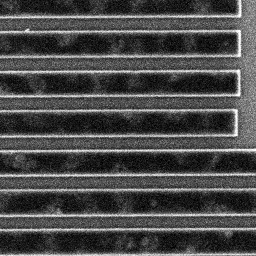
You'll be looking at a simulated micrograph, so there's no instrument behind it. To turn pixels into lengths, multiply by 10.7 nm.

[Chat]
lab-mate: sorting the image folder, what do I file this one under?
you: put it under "parallel lines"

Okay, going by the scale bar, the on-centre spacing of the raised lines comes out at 426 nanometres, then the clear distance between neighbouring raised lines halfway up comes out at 145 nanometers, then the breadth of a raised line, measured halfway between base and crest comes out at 0.281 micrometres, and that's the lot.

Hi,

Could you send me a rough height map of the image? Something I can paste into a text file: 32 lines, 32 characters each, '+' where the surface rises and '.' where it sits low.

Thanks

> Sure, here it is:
++++++++++++++++++++++++++++++..
++++++++++++++++++++++++++++++..
................................
................................
++++++++++++++++++++++++++++++..
++++++++++++++++++++++++++++++..
++++++++++++++++++++++++++++++..
................................
................................
++++++++++++++++++++++++++++++..
++++++++++++++++++++++++++++++..
++++++++++++++++++++++++++++++..
................................
................................
++++++++++++++++++++++++++++++..
++++++++++++++++++++++++++++++..
++++++++++++++++++++++++++++++..
................................
................................
++++++++++++++++++++++++++++++++
++++++++++++++++++++++++++++++++
++++++++++++++++++++++++++++++++
................................
................................
++++++++++++++++++++++++++++++++
++++++++++++++++++++++++++++++++
++++++++++++++++++++++++++++++++
................................
................................
++++++++++++++++++++++++++++++++
++++++++++++++++++++++++++++++++
++++++++++++++++++++++++++++++++